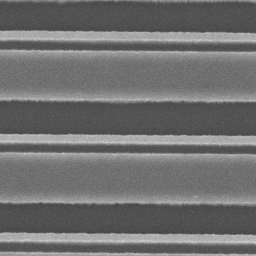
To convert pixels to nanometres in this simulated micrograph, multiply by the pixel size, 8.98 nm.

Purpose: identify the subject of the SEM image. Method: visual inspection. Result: lines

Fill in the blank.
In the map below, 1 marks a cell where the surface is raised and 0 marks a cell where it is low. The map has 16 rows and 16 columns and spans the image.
0000000000000000
0000000000000000
1111111111111111
1111111111111111
1111111111111111
1111111111111111
0000000000000000
0000000000000000
1111111111111100
1111111111111111
1111111111111111
1111111111111111
1111111111111111
0000000000000000
0000000000000000
1111111111111111